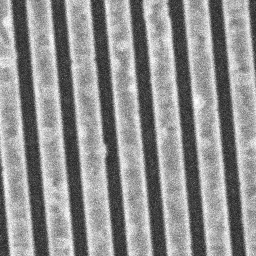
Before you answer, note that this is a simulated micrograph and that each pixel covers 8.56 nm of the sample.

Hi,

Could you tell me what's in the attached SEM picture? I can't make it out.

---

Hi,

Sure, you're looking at parallel lines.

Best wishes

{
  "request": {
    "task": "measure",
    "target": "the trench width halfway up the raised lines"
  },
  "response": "0.142 microns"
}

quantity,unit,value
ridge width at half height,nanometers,193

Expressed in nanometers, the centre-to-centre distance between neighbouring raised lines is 336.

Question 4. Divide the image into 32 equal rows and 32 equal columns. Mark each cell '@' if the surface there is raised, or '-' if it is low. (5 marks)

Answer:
@--@@@--@@@--@@@--@@@--@@@--@@@-
@---@@--@@@--@@@--@@@--@@@--@@@-
@---@@---@@--@@@--@@@--@@@--@@@-
@@--@@---@@---@@--@@@--@@@--@@@-
@@--@@@--@@@--@@---@@--@@@--@@@-
@@--@@@--@@@--@@---@@---@@--@@@-
@@--@@@--@@@--@@@--@@@--@@---@@-
@@--@@@--@@@--@@@--@@@--@@@--@@@
@@--@@@--@@@--@@@--@@@--@@@--@@@
@@--@@@--@@@--@@@--@@@--@@@--@@@
@@--@@@--@@@--@@@--@@@--@@@--@@@
@@--@@@--@@@--@@@--@@@--@@@--@@@
@@---@@--@@@--@@@--@@@--@@@--@@@
@@---@@---@@--@@@--@@@--@@@--@@@
@@@--@@---@@---@@--@@@--@@@--@@@
@@@--@@@--@@@--@@---@@--@@@--@@@
@@@--@@@--@@@--@@---@@@--@@--@@@
@@@--@@@--@@@--@@@--@@@--@@---@@
@@@--@@@--@@@--@@@--@@@--@@@--@@
@@@--@@@--@@@--@@@--@@@--@@@--@@
@@@--@@@--@@@--@@@--@@@--@@@--@@
@@@--@@@--@@@--@@@--@@@--@@@--@@
-@@---@@--@@@--@@@--@@@--@@@--@@
-@@---@@---@@--@@@--@@@--@@@--@@
-@@---@@---@@---@@--@@@--@@@--@@
-@@@--@@---@@---@@---@@--@@@--@@
-@@@--@@@--@@@--@@---@@---@@--@@
-@@@--@@@--@@@--@@---@@---@@--@@
-@@@--@@@--@@@--@@@--@@@--@@---@
-@@@--@@@--@@@--@@@--@@@--@@@--@
-@@@--@@@--@@@--@@@--@@@--@@@--@
-@@@--@@@--@@@--@@@--@@@--@@@--@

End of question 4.